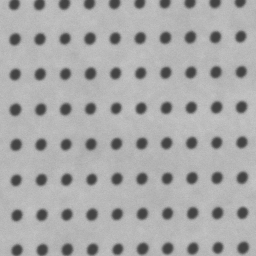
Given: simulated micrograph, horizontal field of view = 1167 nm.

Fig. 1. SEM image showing a regular array of holes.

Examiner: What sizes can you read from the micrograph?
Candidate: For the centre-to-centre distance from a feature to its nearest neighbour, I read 0.114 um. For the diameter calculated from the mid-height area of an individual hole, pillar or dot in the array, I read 0.0515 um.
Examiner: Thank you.